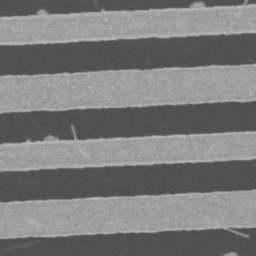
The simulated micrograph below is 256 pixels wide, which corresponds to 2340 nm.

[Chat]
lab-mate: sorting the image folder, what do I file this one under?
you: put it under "lines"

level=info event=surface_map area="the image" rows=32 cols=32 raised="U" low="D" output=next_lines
DDDDDDDDDDDDDDDDDDDDDDDDDDDDDDDD
DDDDDDDDDDDDDDUUUUUUUUUUUUUUUUUU
UUUUUUUUUUUUUUUUUUUUUUUUUUUUUUUU
UUUUUUUUUUUUUUUUUUUUUUUUUUUUUUUU
UUUUUUUUUUUUUUUUUUUDUDDDDDDDDDDD
UUUDDDDDDDDDDDDDDDDDDDDDDDDDDDDD
DDDDDDDDDDDDDDDDDDDDDDDDDDDDDDDD
DDDDDDDDDDDDDDDDDDDDDDDDDDDDDDDD
DDDDDDDDDDDDDDDDDDDDDDDDUUUUUUUU
DDDUUUUUUUUUUUUUUUUUUUUUUUUUUUUU
UUUUUUUUUUUUUUUUUUUUUUUUUUUUUUUU
UUUUUUUUUUUUUUUUUUUUUUUUUUUUUUUU
UUUUUUUUUUUUUUUUUUUUUUUUUUUUUUUU
UUUUUUUUUDDDDDDDDDDDDDDDDDDDDDDD
DDDDDDDDDDDDDDDDDDDDDDDDDDDDDDDD
DDDDDDDDDDDDDDDDDDDDDDDDDDDDDDDD
DDDDDDDDDDDDDDDDDDDDDDDDDDDDDDDU
DDDDDDDDDUDUUUUUUUUUUUUUUUUUUUUU
UUUUUUUUUUUUUUUUUUUUUUUUUUUUUUUU
UUUUUUUUUUUUUUUUUUUUUUUUUUUUUUUU
UUUUUUUUUUUUUUUUUUDDDDDDDDDDDDDD
DDDDDDDDDDDDDDDDDDDDDDDDDDDDDDDD
DDDDDDDDDDDDDDDDDDDDDDDDDDDDDDDD
DDDDDDDDDDDDDDDDDDDDDDDDDDDDDDDD
DDDDDDDDDDDDDDDDDDDDUUUUUUUUUUUU
UUUUUUUUUUUUUUUUUUUUUUUUUUUUUUUU
UUUUUUUUUUUUUUUUUUUUUUUUUUUUUUUU
UUUUUUUUUUUUUUUUUUUUUUUUUUUUUUUU
UUUUUUUUUUUUUUUUUUUUUUUUUUUUUDDD
UUUUDDDDDDDDDDDDDDDDDDDDDDDDDDDD
DDDDDDDDDDDDDDDDDDDDDDDDDDDDDDDD
DDDDDDDDDDDDDDDDDDDDDDDDDDDDDDDD